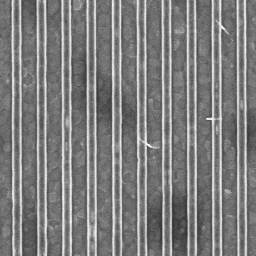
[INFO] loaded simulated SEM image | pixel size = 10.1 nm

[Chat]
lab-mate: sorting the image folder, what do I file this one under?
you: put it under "parallel lines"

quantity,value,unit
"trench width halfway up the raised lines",171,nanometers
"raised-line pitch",252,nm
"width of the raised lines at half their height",80.5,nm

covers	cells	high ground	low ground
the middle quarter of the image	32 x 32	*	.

**....**....**....**.....**....*
**....**....**....**.....**....*
**....**....**....**.....**....*
*.....**....**....**.....**....*
**....**....**....**.....**....*
**....**....**....**.....**....*
**....**....**....**.....**....*
*.....**....**.....*.....**....*
*.....**....**.....*.....**....*
*.....**....**.....*.....**....*
**....**....**.....*.....**....*
**....**....**.....*.....**....*
*.....**....**.....*.....**....*
*.....**....**.....*.....**....*
*.....**....**.....*.....**....*
*.....**....**.....*.....**....*
**....**....**.....*.....**....*
**....**....**.....**....**....*
**....**....**.....**....**....*
**....**....**.....**....**....*
**....**....**.....**....**....*
**....**....**.....**....**....*
**....**....**.....**....**....*
**....**....**.....**....**....*
**....**....**.....**....**....*
**....**....**.....**....**....*
**....**....**.....**....**....*
**....**....**.....**....**....*
**....**....**.....**....**....*
**....**....**.....*.....**....*
**....**....**.....*.....**....*
**....**....**.....**....**....*